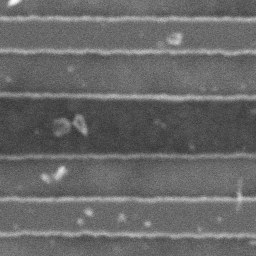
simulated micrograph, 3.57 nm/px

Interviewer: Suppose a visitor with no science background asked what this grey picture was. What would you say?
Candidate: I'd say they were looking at lines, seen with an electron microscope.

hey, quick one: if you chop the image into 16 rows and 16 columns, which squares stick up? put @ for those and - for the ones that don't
----------------
@@@@@@@@@@@@@@@@
@@@@@@@@@@@@@@@@
----------------
----------------
----------------
@@@@@@@@@@@@@@@@
@@@@@@@@@@@@@@@@
@@@@@@@@@@@@@@@@
@@@@@@@@@@@@@@@@
----------------
----------------
@@@@@@@@@@@@@@@@
@@@@@@@@@@@@@@@@
@@@@@@@@@@@@@@@@
----------------